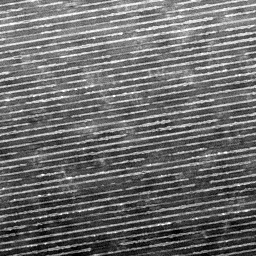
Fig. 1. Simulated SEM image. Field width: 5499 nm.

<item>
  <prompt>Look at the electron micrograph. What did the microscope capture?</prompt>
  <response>parallel lines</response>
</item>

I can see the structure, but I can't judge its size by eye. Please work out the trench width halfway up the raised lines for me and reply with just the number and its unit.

5.31 pixels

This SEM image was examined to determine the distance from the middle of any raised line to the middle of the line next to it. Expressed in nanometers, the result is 144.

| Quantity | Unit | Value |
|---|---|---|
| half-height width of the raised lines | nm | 31.8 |